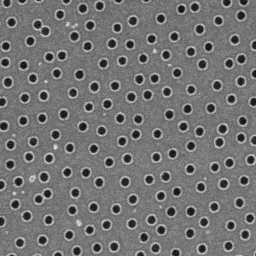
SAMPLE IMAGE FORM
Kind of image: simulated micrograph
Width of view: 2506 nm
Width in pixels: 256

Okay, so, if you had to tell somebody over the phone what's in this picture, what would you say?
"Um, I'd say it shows a regular array of holes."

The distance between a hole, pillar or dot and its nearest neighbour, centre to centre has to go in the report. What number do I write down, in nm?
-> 177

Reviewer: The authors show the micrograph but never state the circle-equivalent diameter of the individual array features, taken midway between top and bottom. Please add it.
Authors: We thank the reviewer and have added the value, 88.3 nanometres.